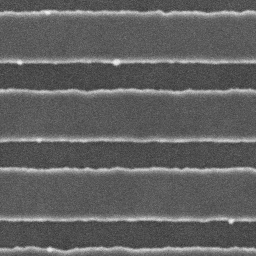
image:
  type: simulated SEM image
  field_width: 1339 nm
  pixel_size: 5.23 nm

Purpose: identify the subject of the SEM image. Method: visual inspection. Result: lines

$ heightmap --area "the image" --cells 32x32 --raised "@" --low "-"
--------------------------------
-@--@@@@@@@@@@@@@@@@-@@@@--@@-@@
@@@@@@@@@@@@@@@@@@@@@@@@@@@@@@@@
@@@@@@@@@@@@@@@@@@@@@@@@@@@@@@@@
@@@@@@@@@@@@@@@@@@@@@@@@@@@@@@@@
@@@@@@@@@@@@@@@@@@@@@@@@@@@@@@@@
@@@@@@@@@@@@@@@@@@@@@@@@@@@@@@@@
@@@@@@@@@@@@@@@@@@@@@@@@@@@@@@@@
--------------------------------
--------------------------------
--------------------------------
@@@@@@@@@@@@@@@@@@@@@@@@@@@@@@@@
@@@@@@@@@@@@@@@@@@@@@@@@@@@@@@@@
@@@@@@@@@@@@@@@@@@@@@@@@@@@@@@@@
@@@@@@@@@@@@@@@@@@@@@@@@@@@@@@@@
@@@@@@@@@@@@@@@@@@@@@@@@@@@@@@@@
@@@@@@@@@@@@@@@@@@@@@@@@@@@@@@@@
@@@@@@@@@@@@@@@@@@@@@@@@@@@@@@@@
--------------------------------
--------------------------------
--------------------------------
@@@@@@@@@@@@@@@@@@@@@@@@@@@@@@@@
@@@@@@@@@@@@@@@@@@@@@@@@@@@@@@@@
@@@@@@@@@@@@@@@@@@@@@@@@@@@@@@@@
@@@@@@@@@@@@@@@@@@@@@@@@@@@@@@@@
@@@@@@@@@@@@@@@@@@@@@@@@@@@@@@@@
@@@@@@@@@@@@@@@@@@@@@@@@@@@@@@@@
-@@@@@@@@@@-@@--@--@@@@@@@@-@@@@
--------------------------------
--------------------------------
--------------------------------
@@@@@@@@@@@@@@@@@@@@@@@@@@@@@@@@